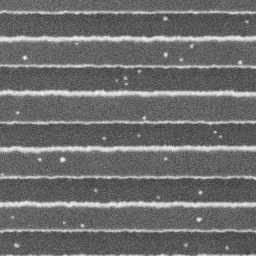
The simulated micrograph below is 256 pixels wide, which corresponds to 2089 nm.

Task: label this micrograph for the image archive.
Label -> lines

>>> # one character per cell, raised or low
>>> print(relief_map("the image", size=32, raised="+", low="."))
++++++++++++++++++++++++++++++++
++++++++++++++++++++++++++++++++
................................
................................
................................
++++++++++++++++++++++++++++++++
++++++++++++++++++++++++++++++++
++++++++++++++++++++++++++++++++
................................
................................
................................
++....+.........................
++++++++++++++++++++++++++++++++
++++++++++++++++++++++++++++++++
++++++++++++++++++++++++++++++++
................................
................................
................................
................................
++++++++++++++++++++++++++++++++
++++++++++++++++++++++++++++++++
++++++++++++++++++++++++++++++++
................................
................................
................................
...+.....+.......+..............
++++++++++++++++++++++++++++++++
++++++++++++++++++++++++++++++++
++++++++++++++++++++++++++++++++
................................
................................
................................